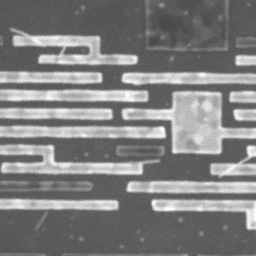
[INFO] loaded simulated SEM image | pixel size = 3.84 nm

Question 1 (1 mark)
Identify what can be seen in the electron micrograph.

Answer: wiring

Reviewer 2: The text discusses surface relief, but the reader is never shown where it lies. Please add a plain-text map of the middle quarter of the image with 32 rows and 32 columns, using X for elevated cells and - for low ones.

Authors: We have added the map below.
--------------------------------
--------------------------------
XXXXXXXXX--------------------XXX
XXXXXXXXX------XXXXXXXXXXXXXXXXX
-XXXXXX---------XXXXXX---XXXXXXX
--------------------------------
--------------------------------
XXXXXXXXXXXXXXXXXXXXX------XXXXX
XXXXXXXXXXXXXXXXXXXXX------XXXXX
---------------------------XXXXX
---------------------------XXXXX
XXXXXXXXXXX----XXXXX-------XXXXX
XXXXXXXXXXXX---XXXXXXXXXXXXXXXXX
XXXXXXXXXXXX---XXXXXXXXXXXXXXXXX
---------------------------XXXXX
---------------------------XXXXX
XXXXXXXXXXXXXXXXXXXXXXXXX--XXXXX
XXXXXXXXXXXXXXXXXXXXXXXXX--XXXXX
---------------------------XXXXX
---------------------------XXXXX
---------------------------XXXXX
-------------XXXXXXXXXXXX--XXXXX
-------------XXXXXXXXXXXX-------
--------------------------------
--------------------------------
XXXXXXXXXXXXXXXXXXX-------------
XXXXXXXXXXXXXXXXXXX-------------
--------------------------------
--------------------------------
--------------------------------
XXXXXXX---------XXXXXXXXXXXXXXXX
----------------XXXXXXXXXXXXXXXX